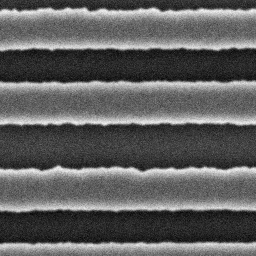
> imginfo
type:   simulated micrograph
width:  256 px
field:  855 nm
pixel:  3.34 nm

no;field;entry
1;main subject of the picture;lines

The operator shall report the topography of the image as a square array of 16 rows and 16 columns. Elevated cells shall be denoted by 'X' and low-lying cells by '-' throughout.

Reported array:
----------------
XXXXXXXXXXXXXXXX
XXXXXXXXXXXXXXXX
----------------
----------------
XXXXXXXXXXXXXXXX
XXXXXXXXXXXXXXXX
XXXXXXXXXXXXXXXX
----------------
----------------
---X------------
XXXXXXXXXXXXXXXX
XXXXXXXXXXXXXXXX
----------------
----------------
XXXXXXXXXXXXXXXX